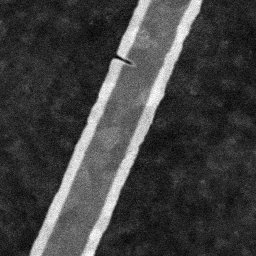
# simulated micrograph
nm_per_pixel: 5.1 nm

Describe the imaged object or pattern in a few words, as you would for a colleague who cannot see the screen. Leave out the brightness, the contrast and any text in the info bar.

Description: one or a few lines or trenches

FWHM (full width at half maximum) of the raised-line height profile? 249 nanometers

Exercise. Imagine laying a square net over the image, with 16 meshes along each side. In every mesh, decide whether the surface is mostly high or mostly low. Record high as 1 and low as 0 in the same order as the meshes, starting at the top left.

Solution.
0000000001110000
0000000011110000
0000000011100000
0000000011100000
0000000111000000
0000000111000000
0000001111000000
0000001110000000
0000011110000000
0000011100000000
0000011100000000
0000111000000000
0000111000000000
0001111000000000
0001110000000000
0011110000000000